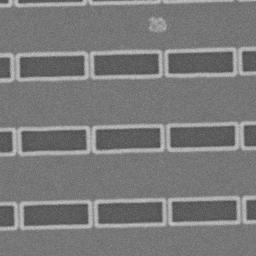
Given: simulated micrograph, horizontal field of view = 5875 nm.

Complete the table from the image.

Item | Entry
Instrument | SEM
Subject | an array of small figures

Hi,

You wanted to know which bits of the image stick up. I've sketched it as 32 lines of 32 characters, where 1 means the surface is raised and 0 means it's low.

01000000001111111111111111111111
11111111111111111111111111111111
11111111111111111111111111111111
11111111111111111111111111111111
11111111111111111111111111111111
11111111111111111111111111111111
11111111111111111101100000000100
00000000000000000000100000000100
00000000000100000000100000000100
01000000000100000000111111111111
11111111111111111111111111111111
11111111111111111111111111111111
11111111111111111111111111111111
11111111111111111111111111111111
11111111111111111111111111111111
11111111111111111111111111100110
00000000000100000000100000000000
00000000000100000000100000000000
00000000000100000000100000000110
11111111111111111111111111111111
11111111111111111111111111111111
11111111111111111111111111111111
11111111111111111111111111111111
11111111111111111111111111111111
11111111111111111111111111111111
01100000000100000000100000000000
00100000000100000000000000000000
00100000000100000000000000000010
01100111111111111111111111111111
11111111111111111111111111111111
11111111111111111111111111111111
11111111111111111111111111111111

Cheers